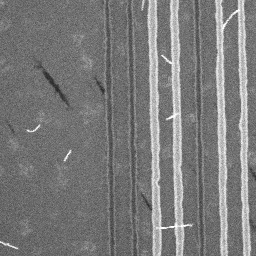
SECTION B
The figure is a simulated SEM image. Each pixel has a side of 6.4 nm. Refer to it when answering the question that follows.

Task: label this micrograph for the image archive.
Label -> parallel lines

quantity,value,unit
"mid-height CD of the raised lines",39.2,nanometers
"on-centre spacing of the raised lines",143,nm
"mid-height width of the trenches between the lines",16.8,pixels